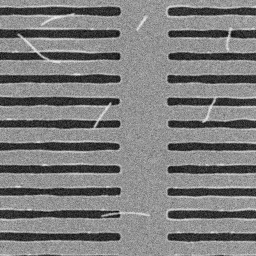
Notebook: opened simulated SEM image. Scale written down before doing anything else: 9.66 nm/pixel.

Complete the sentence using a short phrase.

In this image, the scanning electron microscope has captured groups of lines, slits or small figures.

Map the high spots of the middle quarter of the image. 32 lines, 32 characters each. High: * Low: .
********************************
********************************
******.....*********************
..............************......
..............************......
********************************
********************************
********************************
..............************......
..............************......
...........*.*************......
********************************
********************************
********************************
..............************......
..............************......
********************************
********************************
********************************
...........*********************
..............************......
..............************......
********************************
********************************
********************************
..............************......
..............************......
.............*************.***..
********************************
********************************
********************************
..............************......